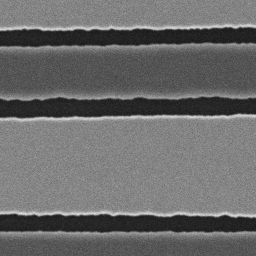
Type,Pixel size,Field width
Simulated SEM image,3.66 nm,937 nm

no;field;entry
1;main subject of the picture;lines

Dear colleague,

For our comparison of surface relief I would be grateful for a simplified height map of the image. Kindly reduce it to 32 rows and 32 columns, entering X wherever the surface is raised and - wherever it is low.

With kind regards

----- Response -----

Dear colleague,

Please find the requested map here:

XXXXXXXXXXXXXXXXXXXXXXXXXXXXXXXX
XXXXXXXXXXXXXXXXXXXXXXXXXXXXXXXX
XXXXXXXXXXXXXXXXXXXXXXXXXXXXXXXX
XXXXXXXXXXXXXXXXXXXXXXXXXX------
--------------------------------
-----------------------XXXX-XXXX
XXXXXXXXXXXXXXXXXXXXXXXXXXXXXXXX
XXXXXXXXXXXXXXXXXXXXXXXXXXXXXXXX
XXXXXXXXXXXXXXXXXXXXXXXXXXXXXXXX
XXXXXXXXXXXXXXXXXXXXXXXXXXXXXXXX
XXXXXXXXXXXXXXXXXXXXXXXXXXXXXXXX
XXXXXXXXXXXXXXXXXXXXXXXXXXXXXXXX
--XX----------------------------
--------------------------------
----------------XX-XXXXXXXXXXXXX
XXXXXXXXXXXXXXXXXXXXXXXXXXXXXXXX
XXXXXXXXXXXXXXXXXXXXXXXXXXXXXXXX
XXXXXXXXXXXXXXXXXXXXXXXXXXXXXXXX
XXXXXXXXXXXXXXXXXXXXXXXXXXXXXXXX
XXXXXXXXXXXXXXXXXXXXXXXXXXXXXXXX
XXXXXXXXXXXXXXXXXXXXXXXXXXXXXXXX
XXXXXXXXXXXXXXXXXXXXXXXXXXXXXXXX
XXXXXXXXXXXXXXXXXXXXXXXXXXXXXXXX
XXXXXXXXXXXXXXXXXXXXXXXXXXXXXXXX
XXXXXXXXXXXXXXXXXXXXXXXXXXXXXXXX
XXXXXXXXXXXXXXXXXXXXXXXXXXXXXXXX
XXXXXXXXXXXXXXXXXXXXXXXXXXXXXXXX
--------------------------------
--------------------------------
XXXXXXXXXXXXXXXXXXXXXXXXXXXXXXXX
XXXXXXXXXXXXXXXXXXXXXXXXXXXXXXXX
XXXXXXXXXXXXXXXXXXXXXXXXXXXXXXXX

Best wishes